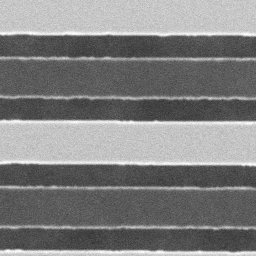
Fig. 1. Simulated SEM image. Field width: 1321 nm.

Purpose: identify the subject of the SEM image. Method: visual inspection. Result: lines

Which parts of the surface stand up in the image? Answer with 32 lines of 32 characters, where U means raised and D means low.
UUUUUUUUUUUUUUUUUUUUUUUUUUUUUUUU
UUUUUUUUUUUUUUUUUUUUUUUUUUUUUUUU
UUUUUUUUUUUUUUUUUUUUUUUUUUUUUUUU
UUUUUUUUUUUUUUUUUUUUUUUUUUUUUUUU
DDDDDDDDDDDDDDDDDDDDDDDDDDDDDDDD
DDDDDDDDDDDDDDDDDDDDDDDDDDDDDDDD
DDDDDDDDDDDDDDDDDDDDDDDDDDDDDDDD
UUUUUUUUUUUUUUUUUUUUUUUUUUUUUUUU
UUUUUUUUUUUUUUUUUUUUUUUUUUUUUUUU
UUUUUUUUUUUUUUUUUUUUUUUUUUUUUUUU
UUUUUUUUUUUUUUUUUUUUUUUUUUUUUUUU
UUUUUUUUUUUUUUUUUUUUUUUUUUUUUUUU
DDDDDDDDDDDDDDDDDDDDDDDDDDDDDDDD
DDDDDDDDDDDDDDDDDDDDDDDDDDDDDDDD
DDDDDDDDDDDDDDDDDDDDDDDDDDDDDDDD
UUUUUUUUUUUUUUUUUUUUUUUUUUUUUUUU
UUUUUUUUUUUUUUUUUUUUUUUUUUUUUUUU
UUUUUUUUUUUUUUUUUUUUUUUUUUUUUUUU
UUUUUUUUUUUUUUUUUUUUUUUUUUUUUUUU
UUUUUUUUUUUUUUUUUUUUUUUUUUUUUUUU
DDDDDDDDDDDDDDDUUUUUUUUUUUUUUUUU
DDDDDDDDDDDDDDDDDDDDDDDDDDDDDDDD
DDDDDDDDDDDDDDDDDDDDDDDDDDDDDDDD
UUUUUUUUUUUUUUUUUUUUUUUUUDDUUUUU
UUUUUUUUUUUUUUUUUUUUUUUUUUUUUUUU
UUUUUUUUUUUUUUUUUUUUUUUUUUUUUUUU
UUUUUUUUUUUUUUUUUUUUUUUUUUUUUUUU
UUUUUUUUUUUUUUUUUUUUUUUUUUUUUUUU
DDDDDDDDDUDDDDDDDDDDDDDDDDUUDDUU
DDDDDDDDDDDDDDDDDDDDDDDDDDDDDDDD
DDDDDDDDDDDDDDDDDDDDDDDDDDDDDDDD
UUUUUUUUUUUUUUUUUUUUUDDDUDDDDDDD